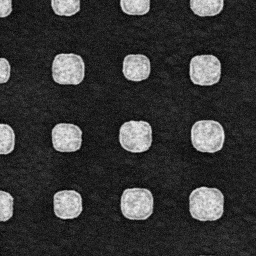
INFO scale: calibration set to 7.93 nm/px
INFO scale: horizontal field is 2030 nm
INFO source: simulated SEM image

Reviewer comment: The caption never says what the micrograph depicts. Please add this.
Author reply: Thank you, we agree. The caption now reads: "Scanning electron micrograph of a regular array of raised bodies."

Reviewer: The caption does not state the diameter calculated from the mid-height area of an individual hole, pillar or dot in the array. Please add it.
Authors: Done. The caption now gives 257 nm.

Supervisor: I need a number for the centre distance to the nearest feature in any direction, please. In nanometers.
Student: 538